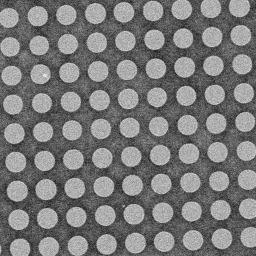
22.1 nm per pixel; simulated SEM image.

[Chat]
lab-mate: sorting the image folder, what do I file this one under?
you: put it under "an array of small figures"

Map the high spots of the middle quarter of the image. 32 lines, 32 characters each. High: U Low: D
UUUDDDDUUUUDDDUUUUDDDUUUUDDDUUUU
UUUUDDUUUUUDDUUUUUDDDUUUUDDDUUUU
UUUUDDUUUUUDDDUUUUDDDUUUUDDDUUUU
UUUDDDDUUUDDDDUUUDDDDDUDDDDDDDDD
DUDDDDDDDDDDDDDDDDDDDDDDDDDDDDDD
DDDDDDDDDDDDDDDDDDDDDDDDDDDDDDDD
DDDDDDDDDDDDDDDUUDDDDDUUUDDDDUUU
UUUDDDDUUUUDDDUUUUDDDUUUUDDDUUUU
UUUUDDUUUUUDDDUUUUDDDUUUUUDDUUUU
UUUUDDDUUUUDDDUUUUDDDUUUUDDDDUUU
UUUUDDDUUUUDDDUUUUDDDDUUDDDDDDDD
UUUDDDDDDDDDDDDDDDDDDDDDDDDDDDDD
DDDDDDDDDDDDDDDDDDDDDDDDDDDDDDDD
DDDDDDDDDDDDDDDDDDDDDDDUUDDDDUUU
DUUDDDDDUUUDDDUUUUDDDDUUUUDDDUUU
UUUUDDDUUUUUDDUUUUUDDUUUUUDDDUUU
UUUUDDDUUUUUDDUUUUUDDDUUUUDDDUUU
UUUUDDDUUUUDDDDUUUDDDDUUUDDDDDUU
DUUDDDDDUUDDDDDDDDDDDDDDDDDDDDDD
DDDDDDDDDDDDDDDDDDDDDDDDDDDDDDDD
DDDDDDDDDDDDDDDDDDDDDDDUUDDDDDUU
DDDDDDDDUUUDDDDUUUDDDDUUUUDDDUUU
UUUUDDDUUUUUDDDUUUUDDDUUUUDDDUUU
UUUUUDDUUUUUDDUUUUUDDDUUUUDDDUUU
UUUUUDDUUUUUDDDUUUUDDDUUUUDDDDUU
DUUUDDDDUUUDDDDDUDDDDDDDDDDDDDDD
DDDDDDDDDDDDDDDDDDDDDDDDDDDDDDDD
DDDDDDDDDDDDDDDDDDDDDDDDDDDDDDDU
DDDDDDDDDUUDDDDDUUUDDDUUUUDDDUUU
DUUUUDDDUUUUDDDUUUUDDDUUUUUDDUUU
UUUUUDDDUUUUDDDUUUUUDDUUUUUDDUUU
UUUUUDDDUUUUDDDUUUUDDDUUUUDDDDUU